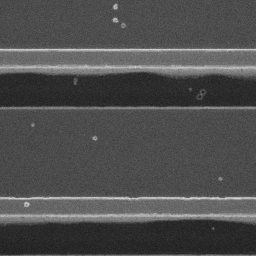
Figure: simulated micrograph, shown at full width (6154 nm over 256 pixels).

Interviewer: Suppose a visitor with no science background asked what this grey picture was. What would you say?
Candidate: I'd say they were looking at lines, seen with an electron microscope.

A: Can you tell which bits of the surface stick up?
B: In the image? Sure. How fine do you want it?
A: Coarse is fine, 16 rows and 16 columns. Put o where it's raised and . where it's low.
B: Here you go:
oooooooooooooooo
oooooooooooooooo
oooooooooooooooo
oooooooooooooooo
................
................
................
oooooooooooooooo
oooooooooooooooo
oooooooooooooooo
oooooooooooooooo
oooooooooooooooo
oooooooooooooooo
oooooooooooooooo
................
................